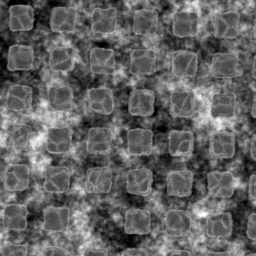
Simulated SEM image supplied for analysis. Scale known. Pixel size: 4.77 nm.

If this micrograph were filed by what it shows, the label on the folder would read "a regular array of raised bodies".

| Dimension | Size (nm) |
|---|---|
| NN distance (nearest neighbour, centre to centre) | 190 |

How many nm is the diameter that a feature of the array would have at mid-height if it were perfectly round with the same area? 125